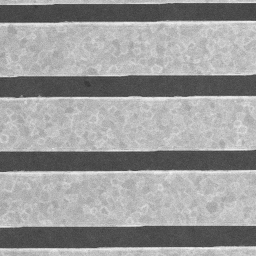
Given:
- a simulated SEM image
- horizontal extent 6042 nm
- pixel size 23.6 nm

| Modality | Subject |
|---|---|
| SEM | lines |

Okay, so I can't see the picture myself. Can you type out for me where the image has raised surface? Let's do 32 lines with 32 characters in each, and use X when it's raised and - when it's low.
XXXXXXX-------------------------
--------------------------------
--------------------------------
XXXXXXXXXXXXXXXXXXXXXXXXXXXXXXXX
XXXXXXXXXXXXXXXXXXXXXXXXXXXXXXXX
XXXXXXXXXXXXXXXXXXXXXXXXXXXXXXXX
XXXXXXXXXXXXXXXXXXXXXXXXXXXXXXXX
XXXXXXXXXXXXXXXXXXXXXXXXXXXXXXXX
XXXXXXXXXXXXXXXXXXXXXXXXXXXXXXXX
XXX-----------------------------
--------------------------------
--------------------------------
XXXXXXXXXXXXXXXXXXXXXXXXXXXXXXXX
XXXXXXXXXXXXXXXXXXXXXXXXXXXXXXXX
XXXXXXXXXXXXXXXXXXXXXXXXXXXXXXXX
XXXXXXXXXXXXXXXXXXXXXXXXXXXXXXXX
XXXXXXXXXXXXXXXXXXXXXXXXXXXXXXXX
XXXXXXXXXXXXXXXXXXXXXXXXXXXXXXXX
XXXXXXXXXXXXXXXXXXXXXXXXXXXXXXXX
--------------------------------
--------------------------------
---X-XXXXXXXXXXXXXXXXXXXXXXXXXXX
XXXXXXXXXXXXXXXXXXXXXXXXXXXXXXXX
XXXXXXXXXXXXXXXXXXXXXXXXXXXXXXXX
XXXXXXXXXXXXXXXXXXXXXXXXXXXXXXXX
XXXXXXXXXXXXXXXXXXXXXXXXXXXXXXXX
XXXXXXXXXXXXXXXXXXXXXXXXXXXXXXXX
XXXXXXXXXXXXXXXXXXXXXXXXXXXXXXXX
--------------------------------
--------------------------------
--------------------------------
XXXXXXXXXXXXXXXXXXXXXXXXXXXXXXXX